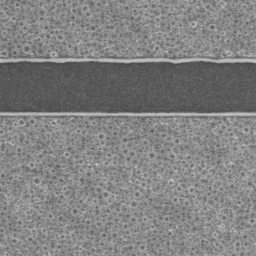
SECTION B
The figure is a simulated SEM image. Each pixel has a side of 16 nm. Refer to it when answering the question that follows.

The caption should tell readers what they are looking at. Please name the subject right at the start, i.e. one or a few lines or trenches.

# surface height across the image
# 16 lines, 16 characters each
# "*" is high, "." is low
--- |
****************
****************
****************
****************
................
................
................
****************
****************
****************
****************
****************
****************
****************
****************
****************